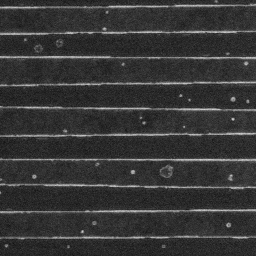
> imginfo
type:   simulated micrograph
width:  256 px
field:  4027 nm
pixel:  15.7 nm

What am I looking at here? lines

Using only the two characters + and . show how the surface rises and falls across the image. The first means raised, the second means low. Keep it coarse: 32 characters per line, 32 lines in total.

................................
++++++++++++++++++++++++++++++++
++++++++++++++++++++++++++++++++
++++++++++++++++++++++++++++++++
................................
................................
................................
++++++++++++++++++++++++++++++++
++++++++++++++++++++++++++++++++
++++++++++++++++++++++++++++++++
+++++++++++.....................
................................
................................
+++++...........................
++++++++++++++++++++++++++++++++
++++++++++++++++++++++++++++++++
++++++++++++++++++++++++++++++++
................................
................................
................................
++++++++++++++++++++++++++++++++
++++++++++++++++++++++++++++++++
++++++++++++++++++++++++++++++++
................................
................................
................................
..............++++++++++++++++++
++++++++++++++++++++++++++++++++
++++++++++++++++++++++++++++++++
++++++++++++++++++++++++++++++++
................................
................................